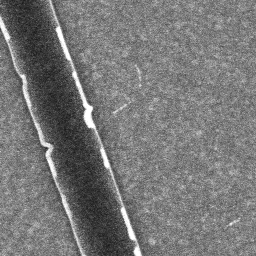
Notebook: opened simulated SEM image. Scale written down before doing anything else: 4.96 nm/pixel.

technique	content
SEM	one or a few lines or trenches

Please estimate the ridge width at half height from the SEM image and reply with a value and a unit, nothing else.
273 nm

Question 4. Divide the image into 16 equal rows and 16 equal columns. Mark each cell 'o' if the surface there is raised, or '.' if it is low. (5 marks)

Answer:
ooo.............
oooo............
oooo............
.ooo............
.oooo...........
.oooo...........
..oooo..........
..oooo..........
..oooo..........
...oooo.........
...oooo.........
....ooo.........
....oooo........
....oooo........
.....ooo........
.....oooo.......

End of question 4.